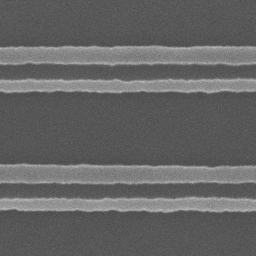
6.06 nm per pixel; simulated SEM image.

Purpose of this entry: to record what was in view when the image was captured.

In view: lines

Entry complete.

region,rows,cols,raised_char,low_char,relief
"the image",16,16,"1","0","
0000000000000000
0000000000000000
0000000000000000
1111111111111111
1111111111111111
1111111111111111
0000000000000000
0000000000000000
0000000000000000
0000000000000000
1111111111111111
1111111111111111
1111111111111111
0000000000000000
0000000000000000
0000000000000000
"